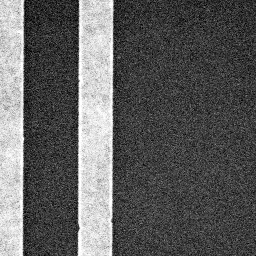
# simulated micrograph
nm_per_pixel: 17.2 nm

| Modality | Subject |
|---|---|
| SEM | one or a few lines or trenches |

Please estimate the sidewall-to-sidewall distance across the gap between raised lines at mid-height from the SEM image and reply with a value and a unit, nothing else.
0.991 µm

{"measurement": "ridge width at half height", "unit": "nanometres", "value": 547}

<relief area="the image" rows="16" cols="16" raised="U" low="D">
UDDDDUUDDDDDDDDD
UDDDDUUDDDDDDDDD
UDDDDUUDDDDDDDDD
UDDDDUUDDDDDDDDD
UDDDDUUDDDDDDDDD
UDDDDUUDDDDDDDDD
UDDDDUUDDDDDDDDD
UDDDDUUDDDDDDDDD
UDDDDUUDDDDDDDDD
UDDDDUUDDDDDDDDD
UDDDDUUDDDDDDDDD
UDDDDUUDDDDDDDDD
UDDDDUUDDDDDDDDD
UDDDDUUDDDDDDDDD
UDDDDUUDDDDDDDDD
UDDDDUUDDDDDDDDD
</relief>